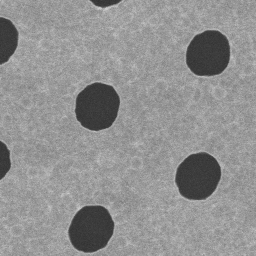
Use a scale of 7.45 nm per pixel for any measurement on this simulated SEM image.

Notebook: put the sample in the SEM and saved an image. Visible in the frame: holes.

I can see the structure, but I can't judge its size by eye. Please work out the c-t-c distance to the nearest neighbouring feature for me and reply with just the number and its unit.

899 nm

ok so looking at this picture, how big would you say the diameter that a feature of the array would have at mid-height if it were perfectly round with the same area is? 343 nanometers